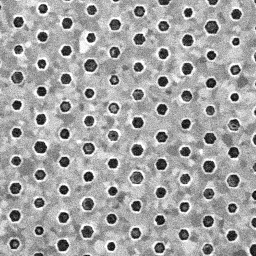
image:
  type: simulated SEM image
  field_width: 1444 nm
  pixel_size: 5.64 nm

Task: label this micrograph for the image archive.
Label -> a regular array of holes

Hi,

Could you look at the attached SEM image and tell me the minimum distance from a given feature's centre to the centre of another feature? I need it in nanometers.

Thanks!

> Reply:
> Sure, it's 155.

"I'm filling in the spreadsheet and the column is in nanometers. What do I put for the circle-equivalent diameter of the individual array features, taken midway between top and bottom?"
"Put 64.9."